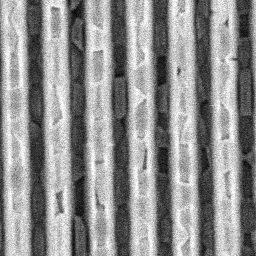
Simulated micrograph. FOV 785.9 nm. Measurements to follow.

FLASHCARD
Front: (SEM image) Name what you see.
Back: parallel lines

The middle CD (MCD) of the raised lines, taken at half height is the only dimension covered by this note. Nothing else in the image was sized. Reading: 66 nanometers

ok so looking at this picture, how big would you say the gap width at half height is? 63.3 nanometres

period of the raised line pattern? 129 nm